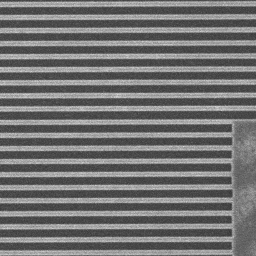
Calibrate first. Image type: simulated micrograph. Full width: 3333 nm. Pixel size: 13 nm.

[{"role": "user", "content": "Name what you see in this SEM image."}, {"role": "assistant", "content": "parallel lines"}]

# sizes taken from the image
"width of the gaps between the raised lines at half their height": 0.122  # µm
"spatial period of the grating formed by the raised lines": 170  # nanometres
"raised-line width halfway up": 48.8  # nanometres